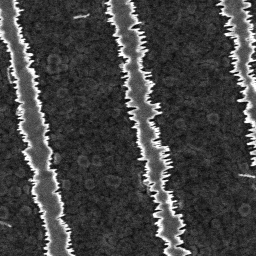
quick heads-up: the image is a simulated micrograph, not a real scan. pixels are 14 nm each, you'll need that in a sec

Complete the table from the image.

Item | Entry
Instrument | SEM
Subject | one or a few lines or trenches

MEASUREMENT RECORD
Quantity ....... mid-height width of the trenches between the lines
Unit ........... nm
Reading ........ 1240